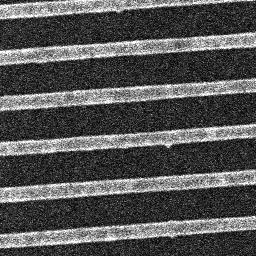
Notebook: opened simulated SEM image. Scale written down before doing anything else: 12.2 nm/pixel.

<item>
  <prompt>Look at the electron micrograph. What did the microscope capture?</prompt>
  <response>parallel lines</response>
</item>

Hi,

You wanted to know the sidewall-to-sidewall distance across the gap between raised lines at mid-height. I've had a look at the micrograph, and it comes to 404 nanometers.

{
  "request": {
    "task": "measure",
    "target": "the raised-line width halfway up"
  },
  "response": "0.146 microns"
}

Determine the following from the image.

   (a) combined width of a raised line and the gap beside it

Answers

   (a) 556 nm